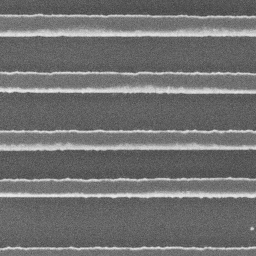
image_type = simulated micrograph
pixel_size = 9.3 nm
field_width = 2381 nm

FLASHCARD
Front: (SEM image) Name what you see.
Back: lines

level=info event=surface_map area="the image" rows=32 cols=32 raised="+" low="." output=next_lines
................................
................................
++++++++++++++++++++++++++++++++
++++++++++++++++++++++++++++++++
................................
................................
................................
................................
................................
++++++++++++++++++++++++++++++++
++++++++++++++++++++++++++++++++
......+...+..........+++++++++++
................................
................................
................................
................................
++++++++++++++++++++++++++++++++
++++++++++++++++++++++++++++++++
++++++++++++++++++++++++++++++++
................................
................................
................................
++++++++++++++++++++++++++++++++
++++++++++++++++++++++++++++++++
...+++++.++++++++++......+++++++
................................
................................
................................
................................
................................
................................
++++++++++++++++++++++++++++++++